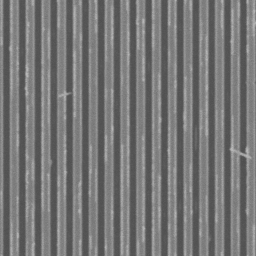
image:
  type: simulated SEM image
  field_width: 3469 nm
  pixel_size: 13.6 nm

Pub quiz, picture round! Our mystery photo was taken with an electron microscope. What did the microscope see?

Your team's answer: parallel lines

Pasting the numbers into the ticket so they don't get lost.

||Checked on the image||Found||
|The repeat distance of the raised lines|214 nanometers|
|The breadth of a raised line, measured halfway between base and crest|8.5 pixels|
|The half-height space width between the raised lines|103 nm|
